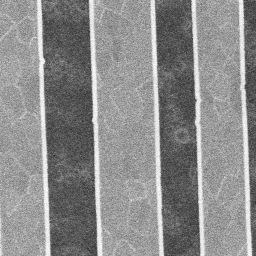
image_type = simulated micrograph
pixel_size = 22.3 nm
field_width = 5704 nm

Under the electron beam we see one or a few lines or trenches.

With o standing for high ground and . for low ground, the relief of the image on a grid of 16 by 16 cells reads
oo....oooo..ooo.
oo....oooo..ooo.
ooo...oooo..ooo.
ooo...oooo..ooo.
ooo...oooo..ooo.
ooo...oooo..ooo.
ooo...oooo..ooo.
ooo...oooo..ooo.
ooo...oooo..ooo.
ooo...oooo..ooo.
ooo...oooo..ooo.
ooo...oooo...oo.
ooo...oooo...oo.
ooo...oooo...oo.
ooo...oooo...ooo
ooo...oooo...ooo